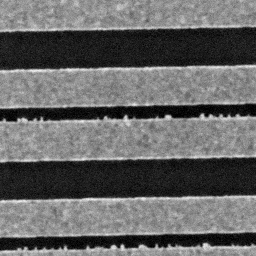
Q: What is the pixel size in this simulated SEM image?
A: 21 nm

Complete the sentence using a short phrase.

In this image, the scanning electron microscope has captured lines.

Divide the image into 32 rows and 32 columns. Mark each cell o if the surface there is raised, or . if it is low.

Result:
oooooooooooooooooooooooooooooooo
oooooooooooooooooooooooooooooooo
oooooooooooooooooooooooooooooooo
ooooooooooooooooooo.............
................................
................................
................................
................................
....................oooooooooooo
oooooooooooooooooooooooooooooooo
oooooooooooooooooooooooooooooooo
oooooooooooooooooooooooooooooooo
oooooooooooooooooooooooooooooooo
................................
................................
oooooooooooooooooooooooooooooooo
oooooooooooooooooooooooooooooooo
oooooooooooooooooooooooooooooooo
oooooooooooooooooooooooooooooooo
oooooooooooooooooooooooooooooooo
................................
................................
................................
................................
................................
oooooooooooooooooooooooooooooooo
oooooooooooooooooooooooooooooooo
oooooooooooooooooooooooooooooooo
oooooooooooooooooooooooooooooooo
ooooo...........................
................................
oooooooooooooooooooooooooooooooo